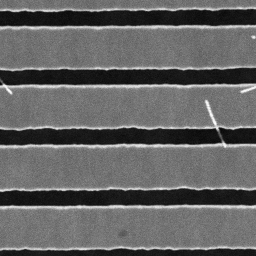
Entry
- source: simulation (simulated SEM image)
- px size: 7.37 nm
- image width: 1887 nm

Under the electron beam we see lines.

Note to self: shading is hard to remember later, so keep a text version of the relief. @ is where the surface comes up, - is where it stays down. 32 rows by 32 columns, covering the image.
@@@@@@@@@@@@@@@@@@@@@@@@@@@@@@@@
--------------------------------
--------------------------------
@@@@@@@@@@@@@@@@@@@@@@@@@@@@@@@@
@@@@@@@@@@@@@@@@@@@@@@@@@@@@@@@@
@@@@@@@@@@@@@@@@@@@@@@@@@@@@@@@@
@@@@@@@@@@@@@@@@@@@@@@@@@@@@@@@@
@@@@@@@@@@@@@@@@@@@@@@@@@@@@@@@@
@@@@@@@@@@@@@@@@@@@@@@@@@@@@@@--
--------------------------------
--------------------------------
@@@@@@@@@@@@@@@@@@@@@@@@@@@@@@@@
@@@@@@@@@@@@@@@@@@@@@@@@@@@@@@@@
@@@@@@@@@@@@@@@@@@@@@@@@@@@@@@@@
@@@@@@@@@@@@@@@@@@@@@@@@@@@@@@@@
@@@@@@@@@@@@@@@@@@@@@@@@@@@@@@@@
--------------------------------
--------------------------------
@@@@@@@@@@@@@@@@@@@@@@@@@@@@@@@@
@@@@@@@@@@@@@@@@@@@@@@@@@@@@@@@@
@@@@@@@@@@@@@@@@@@@@@@@@@@@@@@@@
@@@@@@@@@@@@@@@@@@@@@@@@@@@@@@@@
@@@@@@@@@@@@@@@@@@@@@@@@@@@@@@@@
@@@@@@@@@@@@@@@@@@@@@@@@@@@@@@@@
--------------------------------
--------------------------------
@@@@@@@@@@@@@@@@@@@@@@@@@@@@@@@@
@@@@@@@@@@@@@@@@@@@@@@@@@@@@@@@@
@@@@@@@@@@@@@@@@@@@@@@@@@@@@@@@@
@@@@@@@@@@@@@@@@@@@@@@@@@@@@@@@@
@@@@@@@@@@@@@@@@@@@@@@@@@@@@@@@@
--------------------------------